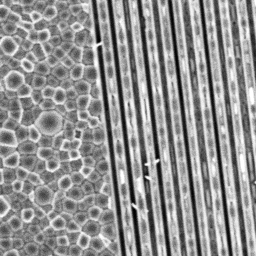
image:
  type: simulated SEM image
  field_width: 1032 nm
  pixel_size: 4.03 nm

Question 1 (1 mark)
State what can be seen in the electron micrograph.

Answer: parallel lines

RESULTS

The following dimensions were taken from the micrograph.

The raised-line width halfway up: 35.5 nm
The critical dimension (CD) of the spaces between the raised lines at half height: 24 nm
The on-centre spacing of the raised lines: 61.1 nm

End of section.